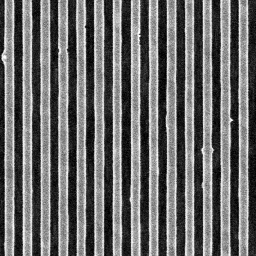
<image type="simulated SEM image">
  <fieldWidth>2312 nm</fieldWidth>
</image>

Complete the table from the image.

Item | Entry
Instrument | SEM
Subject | parallel lines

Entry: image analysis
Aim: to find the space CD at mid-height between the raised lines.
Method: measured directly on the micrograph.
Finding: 86.9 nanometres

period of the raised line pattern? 163 nanometres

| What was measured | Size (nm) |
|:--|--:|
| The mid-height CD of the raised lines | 79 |